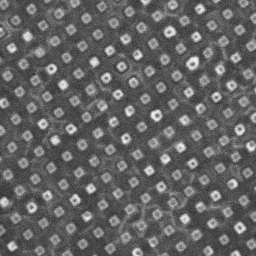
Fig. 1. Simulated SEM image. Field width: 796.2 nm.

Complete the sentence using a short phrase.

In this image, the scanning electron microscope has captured a regular array of raised bodies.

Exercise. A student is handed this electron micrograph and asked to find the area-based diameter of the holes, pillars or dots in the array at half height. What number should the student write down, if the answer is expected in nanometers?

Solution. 27.6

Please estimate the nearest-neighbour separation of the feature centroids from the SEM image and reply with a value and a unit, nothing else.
59.2 nm